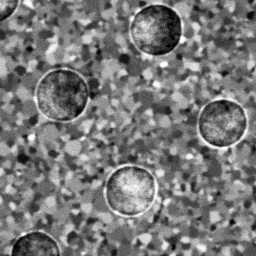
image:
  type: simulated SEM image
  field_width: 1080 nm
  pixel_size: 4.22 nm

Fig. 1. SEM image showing holes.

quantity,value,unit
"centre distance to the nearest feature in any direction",0.481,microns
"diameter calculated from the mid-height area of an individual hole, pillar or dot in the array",218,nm